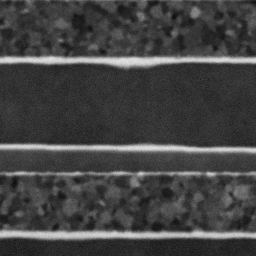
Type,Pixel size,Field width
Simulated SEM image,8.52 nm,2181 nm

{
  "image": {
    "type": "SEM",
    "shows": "lines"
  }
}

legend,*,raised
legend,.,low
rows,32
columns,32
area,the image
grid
********************************
********************************
********************************
********************************
********************************
********************************
********************************
................................
................................
................................
................................
................................
................................
................................
................................
................................
................................
................................
*********.......................
********************************
********************************
********************************
********************************
********************************
********************************
********************************
********************************
********************************
********************************
................................
................................
................................